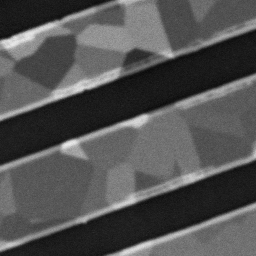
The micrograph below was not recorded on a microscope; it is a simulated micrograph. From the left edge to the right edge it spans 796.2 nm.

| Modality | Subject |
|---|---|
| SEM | one or a few lines or trenches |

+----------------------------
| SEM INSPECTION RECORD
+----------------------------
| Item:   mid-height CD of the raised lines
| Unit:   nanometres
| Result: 234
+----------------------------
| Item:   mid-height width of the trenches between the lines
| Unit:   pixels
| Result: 47.2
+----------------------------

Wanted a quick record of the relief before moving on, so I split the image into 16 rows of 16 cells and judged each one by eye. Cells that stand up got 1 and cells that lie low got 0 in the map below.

0000001111111111
0001111111111111
1111111111111100
1111111111100000
1111111100000000
1111100000000011
1100000000011111
0000000001111111
0000001111111111
0001111111111111
1111111111111100
1111111111100000
1111111100000000
1111110000000011
1110000000011111
0000000001111111